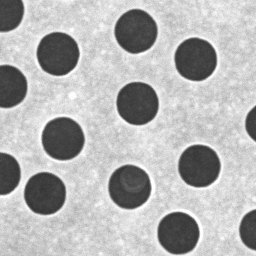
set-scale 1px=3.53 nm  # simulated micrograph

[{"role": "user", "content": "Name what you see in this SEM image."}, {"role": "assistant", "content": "a regular array of holes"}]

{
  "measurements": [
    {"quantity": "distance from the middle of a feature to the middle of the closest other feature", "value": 237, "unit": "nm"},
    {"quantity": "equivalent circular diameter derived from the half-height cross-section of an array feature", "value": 153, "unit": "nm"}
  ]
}